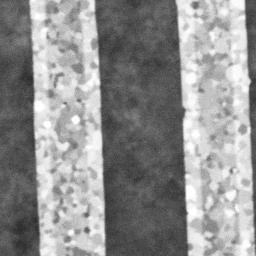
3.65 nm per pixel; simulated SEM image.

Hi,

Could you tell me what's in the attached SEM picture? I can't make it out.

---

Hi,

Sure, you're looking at one or a few lines or trenches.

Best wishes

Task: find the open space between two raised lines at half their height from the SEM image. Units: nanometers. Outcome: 359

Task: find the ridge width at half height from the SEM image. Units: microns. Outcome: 0.184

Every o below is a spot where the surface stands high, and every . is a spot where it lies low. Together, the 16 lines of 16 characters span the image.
..ooo.......ooo.
..ooo.......ooo.
..oooo......ooo.
...ooo......ooo.
...ooo......ooo.
...ooo......ooo.
...ooo......ooo.
...ooo......ooo.
...ooo......ooo.
...ooo......ooo.
...ooo......ooo.
...ooo......ooo.
...ooo......ooo.
...ooo......ooo.
...ooo......ooo.
...ooo......ooo.